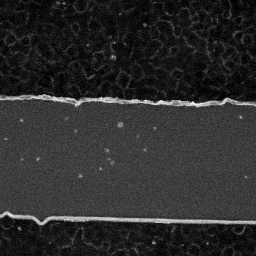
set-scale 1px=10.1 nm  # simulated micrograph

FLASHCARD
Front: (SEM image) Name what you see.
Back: one or a few lines or trenches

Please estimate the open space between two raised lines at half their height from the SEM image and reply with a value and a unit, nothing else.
1180 nm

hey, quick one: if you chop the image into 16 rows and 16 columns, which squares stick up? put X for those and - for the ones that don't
XXXXXXXXXXXXXXXX
XXXXXXXXXXXXXXXX
XXXXXXXXXXXXXXXX
XXXXXXXXXXXXXXXX
XXXXXXXXXXXXXXXX
XXXXXXXXXXXXXXXX
-----------XX--X
----------------
----------------
----------------
----------------
----------------
----------------
X---------------
XXXXXXXXXXXXXXXX
XXXXXXXXXXXXXXXX